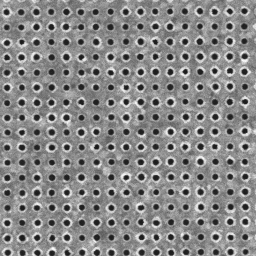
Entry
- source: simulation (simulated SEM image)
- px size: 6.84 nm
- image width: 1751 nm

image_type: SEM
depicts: a regular array of holes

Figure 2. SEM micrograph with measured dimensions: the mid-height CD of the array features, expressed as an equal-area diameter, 43.7 nanometres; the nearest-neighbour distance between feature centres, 99.9 nanometres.